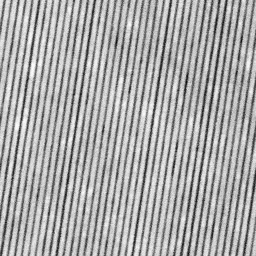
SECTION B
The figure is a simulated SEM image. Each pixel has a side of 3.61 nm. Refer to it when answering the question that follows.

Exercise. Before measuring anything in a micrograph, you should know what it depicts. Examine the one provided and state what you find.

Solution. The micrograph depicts parallel lines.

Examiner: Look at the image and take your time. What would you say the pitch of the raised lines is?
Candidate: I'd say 0.0247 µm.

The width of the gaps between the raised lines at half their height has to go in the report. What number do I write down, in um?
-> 0.0093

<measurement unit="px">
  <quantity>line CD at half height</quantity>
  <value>4.21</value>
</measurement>